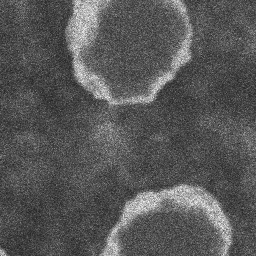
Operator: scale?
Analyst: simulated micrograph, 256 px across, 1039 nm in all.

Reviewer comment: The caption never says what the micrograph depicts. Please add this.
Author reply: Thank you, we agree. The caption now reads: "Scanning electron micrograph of raised bodies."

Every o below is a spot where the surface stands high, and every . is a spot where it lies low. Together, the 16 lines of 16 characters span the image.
.....oooooo.....
.....ooooooo....
.....ooooooo....
.....oooooo.....
.....oooooo.....
.....ooooo......
.......o........
................
................
................
................
................
.........oooo...
........oooooo..
.......ooooooo..
.......ooooooo..